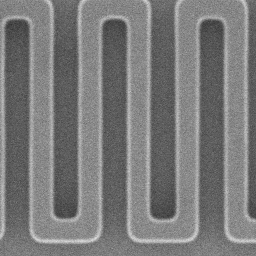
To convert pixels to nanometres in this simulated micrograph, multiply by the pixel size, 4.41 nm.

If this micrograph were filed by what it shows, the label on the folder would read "groups of lines, slits or small figures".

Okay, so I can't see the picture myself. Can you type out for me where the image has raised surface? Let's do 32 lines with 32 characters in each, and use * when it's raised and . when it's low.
******....*********...*********.
******....*********...*********.
*..****...***...***...***...***.
*...***...***...***...***...***.
....***...***...***...***...***.
....**....***...***...***...***.
....**....***...***...***...***.
....**....***...***...***...***.
....**....***...***...***...***.
....**....***...***...***...***.
....**....***...***...***...***.
....**....***...***...***...***.
....**....***...***...***...***.
....**....***...***...***...***.
....**....***...***...***...***.
....**....***...***...***...***.
....**....***...***...***...***.
....**....***...***...***...***.
....**....***...***...***...***.
....**....***...***...***...***.
....**....***...***...***...***.
....**....***...***...***...***.
....**....***...***...***...***.
....**....***...***...***...***.
....**....***...***...***...***.
....**....***...***...***...***.
....***...***...***...***...***.
....*********...****.****...****
....*********...*********...****
....********....********.....***
................................
................................